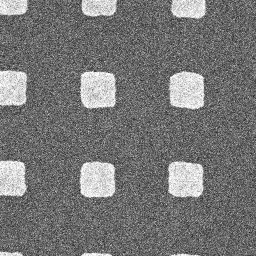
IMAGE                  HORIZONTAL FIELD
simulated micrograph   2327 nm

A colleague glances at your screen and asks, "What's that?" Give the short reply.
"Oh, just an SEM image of raised bodies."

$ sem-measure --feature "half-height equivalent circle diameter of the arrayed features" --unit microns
0.34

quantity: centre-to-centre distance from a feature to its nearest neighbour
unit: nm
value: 805